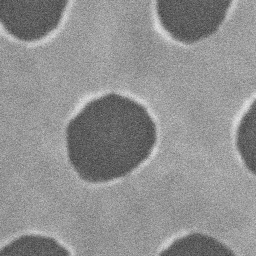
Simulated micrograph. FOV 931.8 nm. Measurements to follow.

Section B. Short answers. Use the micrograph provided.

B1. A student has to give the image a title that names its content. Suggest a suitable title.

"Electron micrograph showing holes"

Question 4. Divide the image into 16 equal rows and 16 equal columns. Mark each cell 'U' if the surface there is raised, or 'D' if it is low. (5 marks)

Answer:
DDDDUUUUUUDDDDUU
DDDDUUUUUUDDDDUU
UDDUUUUUUUUDDUUU
UUUUUUUUUUUUUUUU
UUUUUUUUUUUUUUUU
UUUUUUUUUUUUUUUU
UUUUUDDDDUUUUUUU
UUUUDDDDDDUUUUUD
UUUUDDDDDDUUUUUD
UUUUDDDDDUUUUUUD
UUUUUDDDDUUUUUUD
UUUUUUUUUUUUUUUU
UUUUUUUUUUUUUUUU
UUUUUUUUUUUUUUUU
UUUUUUUUUUUUUUUU
DDDDUUUUUUDDDDUU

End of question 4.